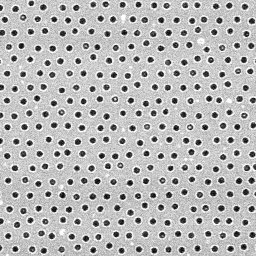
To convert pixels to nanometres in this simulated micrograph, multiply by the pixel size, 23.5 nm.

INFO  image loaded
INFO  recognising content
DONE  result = a regular array of holes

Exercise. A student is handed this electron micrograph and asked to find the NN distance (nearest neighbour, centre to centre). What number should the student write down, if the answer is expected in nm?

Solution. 311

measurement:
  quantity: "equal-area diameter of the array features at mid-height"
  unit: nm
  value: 163